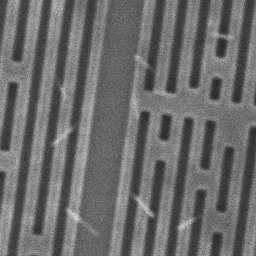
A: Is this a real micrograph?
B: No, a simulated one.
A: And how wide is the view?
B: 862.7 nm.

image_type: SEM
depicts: groups of lines, slits or small figures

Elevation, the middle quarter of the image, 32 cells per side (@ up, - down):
-@@---@@@---------@@@--@@@---@@@
@@@---@@----------@@---@@@---@@@
@@@---@@----------@@---@@@---@@@
@@@---@@----------@@---@@@--@@@-
@@@---@@----------@@---@@@--@@@-
@@@---@@---------@@@---@@---@@@-
@@---@@@---------@@@--@@@---@@@@
@@---@@@---------@@@@@@@@@--@@@@
@@---@@----------@@@@@@@@@@@@@@@
@@---@@----------@@@@@@@@@@@@@@@
@@---@@----------@@@@@@@@@@@@@@@
@@---@@----------@@-@@@@@@@@@@@@
@@---@@----------@@---@@--@@@@@@
@@--@@@---------@@@---@@---@@@--
@---@@@---------@@---@@@---@@@--
@---@@@---------@@---@@@---@@@--
@@--@@----------@@---@@@---@@@--
@---@@----------@@---@@@---@@---
@---@@----------@@---@@@--@@@---
@---@@---------@@@---@@@@@@@@---
@---@@---------@@@---@@@@@@@@---
---@@@---------@@@---@@@@@@@@---
---@@----------@@---@@@@@@@@@---
---@@----------@@---@@@@@@@@---@
---@@----------@@---@@@--@@@---@
---@@----------@@---@@----@@---@
---@@----------@@---@@---@@@---@
--@@@---------@@@---@@---@@@---@
--@@@---------@@@--@@@---@@@---@
--@@@---------@@@--@@@---@@@--@@
--@@----------@@---@@@---@@@--@@
--@@----------@@---@@@---@@---@@